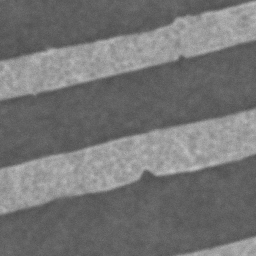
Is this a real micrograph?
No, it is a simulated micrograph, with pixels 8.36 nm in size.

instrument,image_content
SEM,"one or a few lines or trenches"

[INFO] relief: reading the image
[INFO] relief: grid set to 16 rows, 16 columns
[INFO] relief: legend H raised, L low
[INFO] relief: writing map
LLLLLLLLLLLLLLLH
LLLLLLLLLLLHHHHH
LLLLLLLHHHHHHHHH
LLHHHHHHHHHHLLLL
HHHHHHHLLLLLLLLL
HHHHLLLLLLLLLLLL
LLLLLLLLLLLLLLLL
LLLLLLLLLLLLLHHH
LLLLLLLLLHHHHHHH
LLLLLHHHHHHHHHHH
LHHHHHHHHHHHLLLL
HHHHHHHHLLLLLLLL
HHHLLLLLLLLLLLLL
LLLLLLLLLLLLLLLL
LLLLLLLLLLLLLLLL
LLLLLLLLLLLLLLHH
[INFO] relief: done